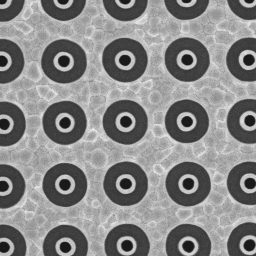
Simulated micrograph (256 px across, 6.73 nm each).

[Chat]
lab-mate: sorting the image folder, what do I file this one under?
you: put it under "a regular array of ring-shaped grooves with a dot in the middle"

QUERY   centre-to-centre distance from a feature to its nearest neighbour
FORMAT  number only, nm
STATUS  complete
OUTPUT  411